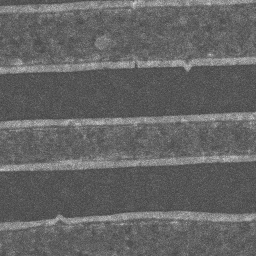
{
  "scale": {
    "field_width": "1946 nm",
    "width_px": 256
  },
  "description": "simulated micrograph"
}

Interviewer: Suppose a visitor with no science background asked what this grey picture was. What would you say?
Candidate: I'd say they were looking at one or a few lines or trenches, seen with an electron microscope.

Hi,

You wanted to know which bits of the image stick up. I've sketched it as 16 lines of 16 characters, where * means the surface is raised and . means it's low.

....************
****************
****************
****************
................
................
................
..........******
****************
****************
................
................
................
.........**.....
****************
****************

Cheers